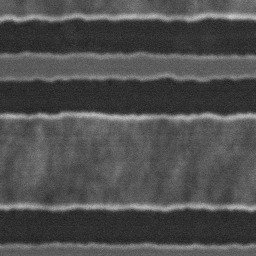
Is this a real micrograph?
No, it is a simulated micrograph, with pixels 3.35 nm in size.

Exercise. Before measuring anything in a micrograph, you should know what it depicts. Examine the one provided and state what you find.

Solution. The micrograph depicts lines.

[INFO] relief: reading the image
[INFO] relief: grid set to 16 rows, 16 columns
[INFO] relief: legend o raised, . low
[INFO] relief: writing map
oooooooooooooooo
................
................
oooooooooooo....
oooooooooooooooo
................
................
oooooooooooooooo
oooooooooooooooo
oooooooooooooooo
oooooooooooooooo
oooooooooooooooo
oooooooooooooooo
................
................
oooooooooooooooo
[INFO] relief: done